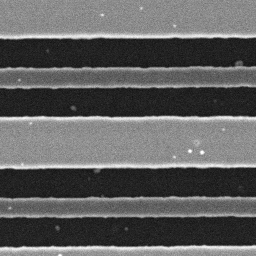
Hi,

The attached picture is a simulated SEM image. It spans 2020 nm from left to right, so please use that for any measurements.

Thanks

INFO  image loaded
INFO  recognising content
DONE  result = lines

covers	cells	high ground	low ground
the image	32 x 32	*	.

********************************
********************************
********************************
********************************
********************************
................................
................................
................................
****..***.**********************
********************************
********************************
................................
................................
................................
................................
********************************
********************************
********************************
********************************
********************************
********************************
................................
................................
................................
................................
********************************
********************************
................................
................................
................................
................................
********************************